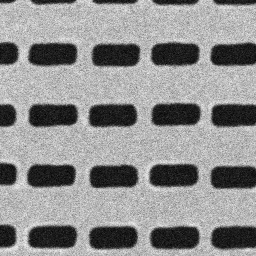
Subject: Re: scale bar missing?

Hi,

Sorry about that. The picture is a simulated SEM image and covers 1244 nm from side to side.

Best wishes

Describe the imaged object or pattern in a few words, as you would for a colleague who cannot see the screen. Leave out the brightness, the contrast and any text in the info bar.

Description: a regular array of holes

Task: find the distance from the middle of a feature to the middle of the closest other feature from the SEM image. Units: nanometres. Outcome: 294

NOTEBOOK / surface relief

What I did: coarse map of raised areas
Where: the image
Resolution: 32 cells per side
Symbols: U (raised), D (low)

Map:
UUUUDDDUUUUUDDDDUUUUDDDDUUUDDDDD
UUUUUUUUUUUUUUUUUUUUUUUUUUUUUUUU
UUUUUUUUUUUUUUUUUUUUUUUUUUUUUUUU
UUUUUUUUUUUUUUUUUUUUUUUUUUUUUUUU
UUUUUUUUUUUUUUUUUUUUUUUUUUUUUUUU
DDUUUDDDDUUUUDDUDUUUDDDUUUUUUUDD
DDUUDDDDDDUUDDDDDDUDDDDDDUDDDDDD
DDUUDDDDDUUUDDDDDUUDDDDDDUDDDDDD
UUUUUUUUUUUUUUUUUUUUUUUUUUUUUUUU
UUUUUUUUUUUUUUUUUUUUUUUUUUUUUUUU
UUUUUUUUUUUUUUUUUUUUUUUUUUUUUUUU
UUUUUUUUUUUUUUUUUUUUUUUUUUUUUUUU
UUUUUUUUUUUUUUUUUUUUUUUUUUUUUUUU
DDUUDDDDDUUUDDDDDUUDDDDDDUUDDDDD
DDUUDDDDDDUDDDDDDUUDDDDDDUDDDDDD
DDUUDDDDDUUDDDDDDUUDDDDDUUUDDDDD
UUUUUUUUUUUUUUUUUUUUUUUUUUUUUUUU
UUUUUUUUUUUUUUUUUUUUUUUUUUUUUUUU
UUUUUUUUUUUUUUUUUUUUUUUUUUUUUUUU
UUUUUUUUUUUUUUUUUUUUUUUUUUUUUUUU
DDUUUUUUUUUUUUUUUUUUUUDDUUUUUUUU
DDUDDDDDDDUDDDDDDUUDDDDDDUDDDDDD
DDUDDDDDDUUDDDDDDUUDDDDDDUDDDDDD
UUUUUUUUUUUUUUUUUUUUUUUUUUUDDDDU
UUUUUUUUUUUUUUUUUUUUUUUUUUUUUUUU
UUUUUUUUUUUUUUUUUUUUUUUUUUUUUUUU
UUUUUUUUUUUUUUUUUUUUUUUUUUUUUUUU
UUUUUUUUUUUUUUUUUUUUUUUUUUUUUUUU
DDUUDDDDDUUUDDDDDUUUDDDDUUUDDDDD
DDUUDDDDDDUDDDDDDUUDDDDDDUDDDDDD
DDUUDDDDDUUDDDDDDUUDDDDDDUDDDDDD
UUUUUUUUUUUUUUUUUUUUUUUUUUUUUUUU